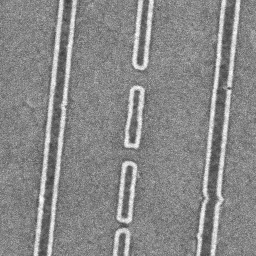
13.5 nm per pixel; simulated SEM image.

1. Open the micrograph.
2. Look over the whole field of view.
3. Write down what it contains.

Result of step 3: one or a few lines or trenches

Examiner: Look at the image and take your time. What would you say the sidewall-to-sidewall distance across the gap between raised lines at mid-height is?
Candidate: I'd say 948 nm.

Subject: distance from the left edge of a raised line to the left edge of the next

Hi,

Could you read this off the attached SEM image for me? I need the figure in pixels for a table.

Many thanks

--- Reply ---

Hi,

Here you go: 81.1